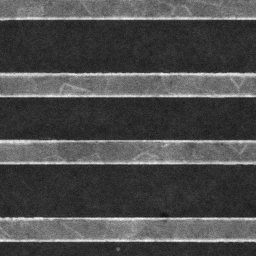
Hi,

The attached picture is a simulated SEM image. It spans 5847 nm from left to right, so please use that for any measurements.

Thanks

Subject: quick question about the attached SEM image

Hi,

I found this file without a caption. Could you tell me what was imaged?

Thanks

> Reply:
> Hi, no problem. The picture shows lines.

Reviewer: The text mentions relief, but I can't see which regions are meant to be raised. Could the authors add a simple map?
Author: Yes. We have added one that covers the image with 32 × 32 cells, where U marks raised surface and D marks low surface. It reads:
UUUUUUUUUUUUUUUUUUUUUUUUUUUUUUUU
UUUUUUUUUUUUUUUUUUUUUUUUUUUUUUUU
DDDDDDDDDDDDDDDDDDDDDDDDDDDDDDDD
DDDDDDDDDDDDDDDDDDDDDDDDDDDDDDDD
DDDDDDDDDDDDDDDDDDDDDDDDDDDDDDDD
DDDDDDDDDDDDDDDDDDDDDDDDDDDDDDDD
DDDDDDDDDDDDDDDDDDDDDDDDDDDDDDDD
DDDDDDDDDDDDDDDDDDDDDDDDDDDDDDDD
DDDDDDDDDDDDDDDDDDDDDDDDDDDDDDDD
UUUUUUUUUUUUUUUUUUUUUUUUUUUUUUUU
UUUUUUUUUUUUUUUUUUUUUUUUUUUUUUUU
UUUUUUUUUUUUUUUUUUUUUUUUUUUUUUUU
DDDDDDDDDDDDDDDDDDDDDDDDDDDDDDDD
DDDDDDDDDDDDDDDDDDDDDDDDDDDDDDDD
DDDDDDDDDDDDDDDDDDDDDDDDDDDDDDDD
DDDDDDDDDDDDDDDDDDDDDDDDDDDDDDDD
DDDDDDDDDDDDDDDDDDDDDDDDDDDDDDDD
DDDDDDDDDDDDDDDDDDDDDDDDDDDDDDDD
UUUUUUUUUUUUUUUUUUUUUUUUUUUUUUUU
UUUUUUUUUUUUUUUUUUUUUUUUUUUUUUUU
DDDDDDDDDDDDDDDDDDDDDDDDDDDDDDDD
DDDDDDDDDDDDDDDDDDDDDDDDDDDDDDDD
DDDDDDDDDDDDDDDDDDDDDDDDDDDDDDDD
DDDDDDDDDDDDDDDDDDDDDDDDDDDDDDDD
DDDDDDDDDDDDDDDDDDDDDDDDDDDDDDDD
DDDDDDDDDDDDDDDDDDDDDDDDDDDDDDDD
DDDDDDDDDDDDDDDDDDDDDDDDDDDDDDDD
UUUUUUUUUUUUUUUUUUUUUUUUUUUUUUUU
UUUUUUUUUUUUUUUUUUUUUUUUUUUUUUUU
UUUUUUUUUUUUUUUUUUUUUUUUUUUUUUUU
DDDDDDDDDDDDDDDDDDDDDDDDDDDDDDDD
DDDDDDDDDDDDDDDDDDDDDDDDDDDDDDDD